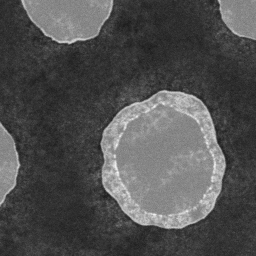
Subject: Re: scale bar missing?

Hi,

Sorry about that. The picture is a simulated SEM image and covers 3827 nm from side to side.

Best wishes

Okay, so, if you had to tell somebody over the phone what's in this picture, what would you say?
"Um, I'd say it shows raised bodies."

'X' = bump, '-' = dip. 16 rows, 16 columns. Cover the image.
--XXXXX-------XX
--XXXX--------XX
---XX-----------
----------------
----------------
----------------
--------XXXXX---
-------XXXXXX---
X-----XXXXXXX---
X-----XXXXXXXX--
X-----XXXXXXXX--
X-----XXXXXXXX--
-------XXXXXX---
--------XXXXX---
----------------
----------------